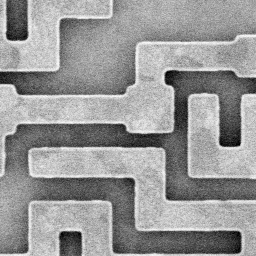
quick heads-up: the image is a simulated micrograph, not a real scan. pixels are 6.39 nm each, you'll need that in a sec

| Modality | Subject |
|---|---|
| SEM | wiring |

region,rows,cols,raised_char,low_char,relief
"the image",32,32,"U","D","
UDDDUUUUUUUUUUDDDDDDDDDDDDDDDDDD
UDDDUUUUUUUUUUDDDDDDDDDDDDDDDDDD
UDDDUUUUDDDDDDDDDDDDDDDDDDDDDDDD
UDDDUUUDDDDDDDDDDDDDDDDDDDDDDDDD
UDDUUUUDDDDDDDDDDDDDDDDDDDDDDDUU
UUUUUUUDDDDDDDDDDUUUUUUUUUUUUUUU
UUUUUUUDDDDDDDDDDUUUUUUUUUUUUUUU
UUUUUUUDDDDDDDDDDUUUUUUUUUUUUUUU
UUUUUUUDDDDDDDDDDUUUUUUUUUUUUUUU
DDDDDDDDDDDDDDDDDUUUUDDDDDDDDDUU
DDDDDDDDDDDDDDDDDUUUUDDDDDDDDDDD
UUDDDDDDDDDDDDDDUUUUUUDDDDDDDDDD
UUUUUUUUUUUUUUUUUUUUUUDDUUUDDDUU
UUUUUUUUUUUUUUUUUUUUUUDDUUUDDDUU
UUUUUUUUUUUUUUUUUUUUUUDDUUUDDDUU
UUDDDDDDDDDDDDDUUUUUUUDDUUUDDDUU
UUDDDDDDDDDDDDDDUUUUUDDDUUUDDDUU
UDDDDDDDDDDDDDDDDDDDDDDDUUUDDDUU
UDDDDDDDDDDDDDDDDDDDDDDDUUUUUUUU
UDDDUUUUUUUUUUUUUUUUUDDDUUUUUUUU
UDDDUUUUUUUUUUUUUUUUUDDDUUUUUUUU
DDDDUUUUUUUUUUUUUUUUUDDDUUUUUUUU
DDDDDDDDDDDDDDDDDUUUUDDDDDDDDDDD
DDDDDDDDDDDDDDDDDUUUUDDDDDDDDDDD
DDDDDDDDDDDDDDDDDUUUUDDDDDDDDDDD
DDDDUUUUUUUUUUDDDUUUUUUUUUUUUUUU
DDDDUUUUUUUUUUDDDUUUUUUUUUUUUUUU
DDDDUUUUUUUUUUDDDUUUUUUUUUUUUUUU
DDDDUUUUUUUUUUDDDUUUUUUUUUUUUUUU
DDDDUUUDDDUUUUDDDDDDDDDDDDDDDDUU
DDDDUUUDDDUUUUDDDDDDDDDDDDDDDDUU
DDDUUUUDDDUUUUDDDDDDDDDDDDDDDDUU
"